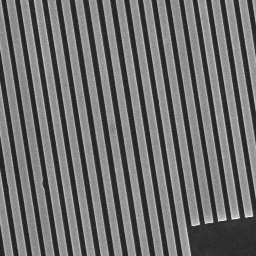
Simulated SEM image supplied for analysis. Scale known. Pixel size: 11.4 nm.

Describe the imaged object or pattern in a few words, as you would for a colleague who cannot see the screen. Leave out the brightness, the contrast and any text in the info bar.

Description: parallel lines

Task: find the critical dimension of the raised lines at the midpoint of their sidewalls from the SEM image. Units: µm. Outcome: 0.0888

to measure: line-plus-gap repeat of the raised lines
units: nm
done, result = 154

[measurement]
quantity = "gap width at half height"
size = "0.0649 micrometres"